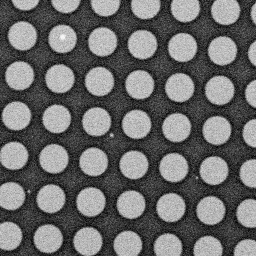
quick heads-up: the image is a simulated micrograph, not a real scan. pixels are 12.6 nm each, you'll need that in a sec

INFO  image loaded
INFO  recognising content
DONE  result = an array of small figures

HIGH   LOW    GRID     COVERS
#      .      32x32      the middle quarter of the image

................................
##.....####.....................
##....######.....####.......##..
##...#######....######....#####.
##...#######....######....######
##....######....######...#######
#.....######....######...#######
.......####.....######....######
..................##.......####.
................................
................................
#.....####......................
#....######.....#####.......#...
##...#######...######.....#####.
#....#######...#######...######.
#....######....#######...#######
.....######....######....#######
......####......#####....######.
.................##.......####..
................................
................................
......###.......................
#....#####.....#####.......#....
#...#######...#######....#####..
#...#######...#######...#######.
#...#######...#######...#######.
.....#####....#######...#######.
......###......#####....#######.
................###......#####..
................................
................................
.....####.......................